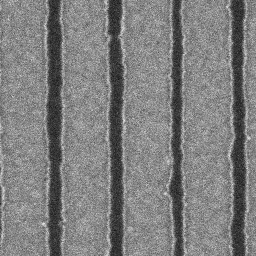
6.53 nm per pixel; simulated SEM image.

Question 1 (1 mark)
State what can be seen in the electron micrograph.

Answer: parallel lines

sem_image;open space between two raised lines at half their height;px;46.1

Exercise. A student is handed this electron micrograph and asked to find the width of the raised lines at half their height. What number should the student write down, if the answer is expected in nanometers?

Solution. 102